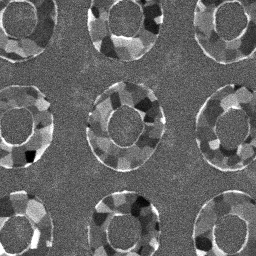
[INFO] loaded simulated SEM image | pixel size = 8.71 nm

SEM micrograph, ring-shaped raised bodies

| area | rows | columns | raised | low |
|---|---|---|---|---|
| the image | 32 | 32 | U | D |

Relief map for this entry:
UDDDUUUDDDDUUUDDDUUUDDDDDUUUDDUU
DDDDDUUDDDDUUUDDDDUUDDDDUUUDDDDU
DDDDDUUDUDDUUUDDDDUUDDDDUUUDDDDU
DDDDUUUDDDDUUUDDDUUUDDDDUUUDDDDU
UUDUUUUDDDDUUDDDDUUUDDDDUUUUDDUU
UUUUUUDDDDDDUUUUUUUDDDDDDUUUUUUU
UUUUUDDDDDDDUUUUUUDDDUDDDUUUUUUU
DUUDDDDDDDDDDDUUUDDDDUDDDDDUUUDD
DDDDDDDDDDDDDDUDDDDDDDDDDDDDDDDD
DDDDDDDDDDDDDDDDDDDDDDDDDDDDDDDD
DDDDDDDDDDDDDDUUUDDDDDDDDDDDDDDD
UUUUUDDDDDDDDUUUUUUDDDDDDDDUUDUU
UUUUUUDDDDDDUUUUUUUUDDDDDDUUUUUU
UUUUUUDDDDDDUUUDDUUUDDDDDUUUUDUU
DDDDUUUDDDDUUUDDDDUUUDDDDUUUDDDU
DDDDUUUDDDDUUUDDDDUUUDDDDUUDDDDU
DDDDUUUDDDDUUUDDDDUUDDDDUUUDDDDU
UDDUUUDDDDDUUUDDDUUUDDDDDUUDDDDU
UUUUUUDDDDDUUUUUUUUUDDDDDUUUUUUU
UUUUUDDDDDDDUUUUUUUDDDDDDUUUUUUU
UUUUDDDDDDDDDUUUUUDDDDDDDDUUUUUD
DDDDDDDDDDDDDDDDDDDDDDDDDDDDDUDD
DDDDDDDDDDDDDDDDDDDDDDDDDDDDDDDD
DDDDDDDDDDDDDDDDDDDDDDDDDDDDDDDD
UUUUDDDDDDDDDUUUUUDDDDDDDDDUUUUD
UUUUUUDDDDDDUUUUUUUDDDDDDDUUUUUU
UUUUUUDDDDDDUUUUUUUUDDDDDUUUUUUU
UDDDUUDDDDDUUUDDDUUUDDDDUUUDDDUU
DDDDDUUDDDDUUDDDDDUUDDDDUUUDDDDU
DDDDUUUDDDDUUUDDDUUUDDDDUUUDDDDU
DDDDUUDDDDDUUUDDDUUUDDDDUUUDDDUU
UDDUUUDDDDDUUUUUUUUDDDDDDUUUDDUU